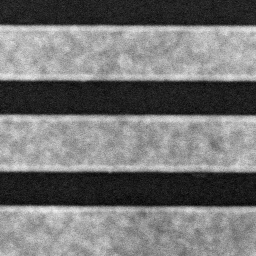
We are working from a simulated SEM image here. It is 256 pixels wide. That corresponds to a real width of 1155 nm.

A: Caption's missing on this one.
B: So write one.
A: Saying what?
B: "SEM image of one or a few lines or trenches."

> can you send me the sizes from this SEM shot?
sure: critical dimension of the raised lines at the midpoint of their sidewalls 230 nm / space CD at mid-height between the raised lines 179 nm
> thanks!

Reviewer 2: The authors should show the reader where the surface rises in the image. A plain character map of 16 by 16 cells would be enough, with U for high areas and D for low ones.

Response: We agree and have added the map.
DDDDDDDDDDDDDDDD
DDDDDDDDDDDDDDDD
UUUUUUUUUUUUUUUU
UUUUUUUUUUUUUUUU
UUUUUUUUUUUUUUUU
DDDDDDDDDDDDDDDD
DDDDDDDDDDDDDDDD
UUUUUUUUUUUUUUUU
UUUUUUUUUUUUUUUU
UUUUUUUUUUUUUUUU
UUUUUUUUUUUUUUUU
DDDDDDDDDDDDDDDD
DDDDDDDDDDDDDDDD
UUUUUUUUUUUUUUUU
UUUUUUUUUUUUUUUU
UUUUUUUUUUUUUUUU